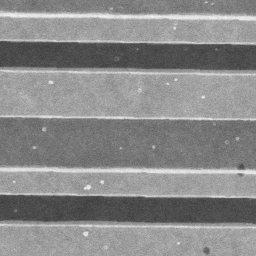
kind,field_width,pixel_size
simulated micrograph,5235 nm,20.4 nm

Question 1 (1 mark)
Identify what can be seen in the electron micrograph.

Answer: lines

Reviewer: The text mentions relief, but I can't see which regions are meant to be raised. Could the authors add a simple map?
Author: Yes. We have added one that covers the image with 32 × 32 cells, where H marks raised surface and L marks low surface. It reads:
LLLLLLLLLLLLLLLLLLLLLLLLLLLLLLLL
LLLLLLLLLLLLLLLLLLLLLLLLLLLLLLLL
HHHHHHHHHHHHHHHHHHHHHHHHHHHHHHHH
HHHHHHHHHHHHHHHHHHHHHHHHHHHHHHHH
HHHHHHHHHHHHHHHHHHHHHHHHHHHHHHHH
LLLLLLLLLLLLLLLLLLLLLLLLLLLLLLLL
LLLLLLLLLLLLLLLLLLLLLLLLLLLLLLLL
LLLLLLLLLLLLLLLLLLLLLLLLLLLLLLLL
LLLLLLLLLLLLLLLLLLLLLLLLLLLLLLLL
HHHHHHHHHHHHHHHHHHHHHHHHHHHHHHHH
HHHHHHHHHHHHHHHHHHHHHHHHHHHHHHHH
HHHHHHHHHHHHHHHHHHHHHHHHHHHHHHHH
HHHHHHHHHHHHHHHHHHHHHHHHHHHHHHHH
HHHHHHHHHHHHHHHHHHHHHHHHHHHHHHHH
HHHHHHHHHHHHHHHHHHHHHHHHHHHHHHHH
LLLLLLLLLLLLLLLLLLLLLLLLLLLLLLLL
LLLLLLLLLLLLLLLLLLLLLLLLLLLLLLLL
LLLLLLLLLLLLLLLLLLLLLLLLLLLLLLLL
LLLLLLLLLLLLLLLLLLLLLLLLLLLLLLLL
LLLLLLLLLLLLLLLLLLLLLLLLLLLLLLLL
LLLLLLLLLLLLLLLLLLLLLLLLLLLLLLLL
HHHHHHHHHHHHHHHHHHHHHHHLLLLLLLLL
HHHHHHHHHHHHHHHHHHHHHHHHHHHHHHHH
HHHHHHHHHHHHHHHHHHHHHHHHHHHHHHHH
LLLLLLLLLLLLLLLLLHHHHHHHHHHHHHHH
LLLLLLLLLLLLLLLLLLLLLLLLLLLLLLLL
LLLLLLLLLLLLLLLLLLLLLLLLLLLLLLLL
LLLLLLLLLLLLLLLLLLLLLLLLLLLLLLLL
HHHHHHHHHHHHHHHHHHHHHHHHHHHHHHHH
HHHHHHHHHHHHHHHHHHHHHHHHHHHHHHHH
HHHHHHHHHHHHHHHHHHHHHHHHHHHHHHHH
HHHHHHHHHHHHHHHHHHHHHHHHHHHHHHHH